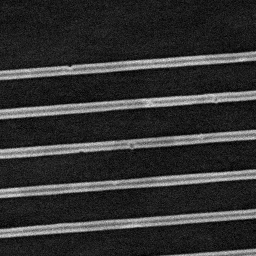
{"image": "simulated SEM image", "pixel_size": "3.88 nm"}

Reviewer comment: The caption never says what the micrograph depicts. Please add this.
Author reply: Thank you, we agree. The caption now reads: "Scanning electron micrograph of parallel lines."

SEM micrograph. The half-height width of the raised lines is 28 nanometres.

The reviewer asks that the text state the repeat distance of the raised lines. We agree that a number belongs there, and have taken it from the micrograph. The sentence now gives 152 nm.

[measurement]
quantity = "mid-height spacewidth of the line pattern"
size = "127 nanometres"